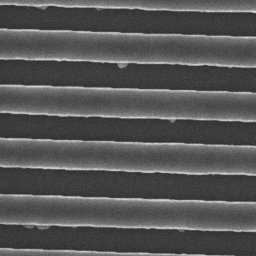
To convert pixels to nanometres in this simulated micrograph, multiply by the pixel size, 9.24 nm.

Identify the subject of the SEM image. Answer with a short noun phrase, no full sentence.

lines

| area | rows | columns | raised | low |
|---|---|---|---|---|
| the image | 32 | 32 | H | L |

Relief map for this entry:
HHHHHHHHHHHHHHHHHHHHHHHHHHHHHHHH
LLLLLLLLLLLLLLLLLLLLLLLLLLLLLLLH
LLLLLLLLLLLLLLLLLLLLLLLLLLLLLLLL
LLLLLLLLLLLLLLLLLLLLLLLLLLLLLLLL
HHHHHHHHHHHHHHHHHHHHHHHHHHLLLLLL
HHHHHHHHHHHHHHHHHHHHHHHHHHHHHHHH
HHHHHHHHHHHHHHHHHHHHHHHHHHHHHHHH
LLLLLLLHHHHHHHHHHHHHHHHHHHHHHHHH
LLLLLLLLLLLLLLLLLLLLLLLLLLLLLLLL
LLLLLLLLLLLLLLLLLLLLLLLLLLLLLLLL
LLLLLLLLLLLLLLLLLLLLLLLLLLLLLLLL
HHHHHHHHHHHHHHHHHHHHHHHHHHHHHLLL
HHHHHHHHHHHHHHHHHHHHHHHHHHHHHHHH
HHHHHHHHHHHHHHHHHHHHHHHHHHHHHHHH
LLLLLLLHHHHHHHHHHHHHHHHHHHHHHHHH
LLLLLLLLLLLLLLLLLLLLLLLLLLLLLLLL
LLLLLLLLLLLLLLLLLLLLLLLLLLLLLLLL
HHHHHHHLLLLLLLLLLLLLLLLLLLLLLLLL
HHHHHHHHHHHHHHHHHHHHHHHHHHHHHHHH
HHHHHHHHHHHHHHHHHHHHHHHHHHHHHHHH
HHHHHHHHHHHHHHHHHHHHHHHHHHHHHHHH
LLLLLLLLLLLLLLLLLLHHHHHHHHHHHHHH
LLLLLLLLLLLLLLLLLLLLLLLLLLLLLLLL
LLLLLLLLLLLLLLLLLLLLLLLLLLLLLLLL
HHHHLLLLLLLLLLLLLLLLLLLLLLLLLLLL
HHHHHHHHHHHHHHHHHHHHHHHHHHHHHHHH
HHHHHHHHHHHHHHHHHHHHHHHHHHHHHHHH
HHHHHHHHHHHHHHHHHHHHHHHHHHHHHHHH
LLLLLLLLLLLLLLLLLLHHHHHHHHHHHHHH
LLLLLLLLLLLLLLLLLLLLLLLLLLLLLLLL
LLLLLLLLLLLLLLLLLLLLLLLLLLLLLLLL
HHHHHHHHHHHHLLLLLLLLLLLLLLLLLLLL